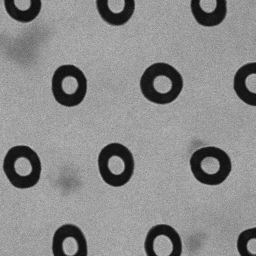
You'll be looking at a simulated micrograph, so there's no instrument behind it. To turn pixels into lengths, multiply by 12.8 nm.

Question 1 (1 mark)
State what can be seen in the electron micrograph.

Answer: ring-shaped grooves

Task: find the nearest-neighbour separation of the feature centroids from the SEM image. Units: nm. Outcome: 1180